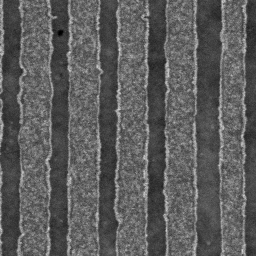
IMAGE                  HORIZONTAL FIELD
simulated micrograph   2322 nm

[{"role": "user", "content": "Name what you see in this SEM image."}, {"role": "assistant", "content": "parallel lines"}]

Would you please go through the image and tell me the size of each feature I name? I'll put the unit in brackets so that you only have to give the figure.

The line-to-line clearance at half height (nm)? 167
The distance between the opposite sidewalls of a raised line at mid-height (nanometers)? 271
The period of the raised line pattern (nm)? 448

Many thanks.